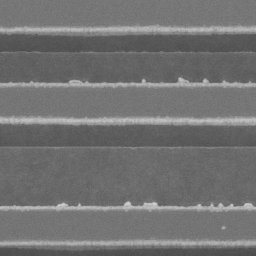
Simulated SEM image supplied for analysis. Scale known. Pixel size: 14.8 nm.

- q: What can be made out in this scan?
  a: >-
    lines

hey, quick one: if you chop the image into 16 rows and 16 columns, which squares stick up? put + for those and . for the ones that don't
++++++++++++++++
++++++++++++++++
................
................
................
++++++++++++++++
++++++++++++++++
++++++++++++++++
................
................
................
................
................
++++++++++++++++
++++++++++++++++
................